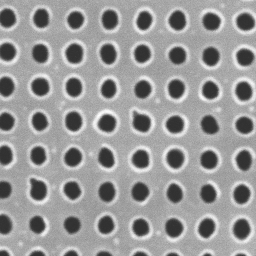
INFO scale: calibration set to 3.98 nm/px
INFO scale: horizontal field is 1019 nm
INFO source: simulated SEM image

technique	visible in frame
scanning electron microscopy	a regular array of holes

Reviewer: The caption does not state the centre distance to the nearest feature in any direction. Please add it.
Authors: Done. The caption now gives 133 nanometers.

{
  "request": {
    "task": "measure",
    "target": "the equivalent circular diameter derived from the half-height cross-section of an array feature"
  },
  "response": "18.6 px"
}